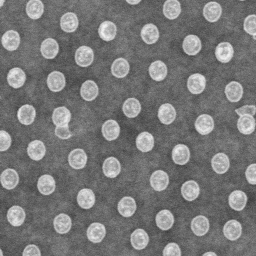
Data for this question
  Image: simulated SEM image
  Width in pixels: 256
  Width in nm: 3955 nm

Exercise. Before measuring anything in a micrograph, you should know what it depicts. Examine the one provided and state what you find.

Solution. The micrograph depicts a regular array of raised bodies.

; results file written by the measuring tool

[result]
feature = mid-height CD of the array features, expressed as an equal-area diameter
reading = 18.8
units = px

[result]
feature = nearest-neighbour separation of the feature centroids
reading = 538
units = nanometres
